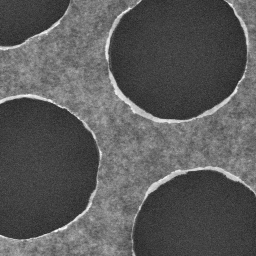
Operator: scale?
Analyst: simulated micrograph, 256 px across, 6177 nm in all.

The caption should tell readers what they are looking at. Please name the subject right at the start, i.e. holes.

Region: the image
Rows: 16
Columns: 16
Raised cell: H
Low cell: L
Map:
LLLLHHHHLLLLLLHH
LLLHHHHLLLLLLLLH
LLHHHHHLLLLLLLLH
HHHHHHHLLLLLLLLH
HHHHHHHLLLLLLLLH
HHHHHHHLLLLLLLLH
LLLHHHHHLLLLLLHH
LLLLLHHHHHHLHHHH
LLLLLLHHHHHHHHHH
LLLLLLHHHHHHHHHH
LLLLLLHHHHHHHHHH
LLLLLLHHHHLLLLLH
LLLLLLHHHLLLLLLL
LLLLLHHHHLLLLLLL
LLLHHHHHLLLLLLLL
HHHHHHHHLLLLLLLL